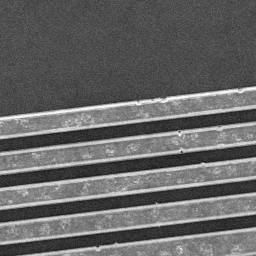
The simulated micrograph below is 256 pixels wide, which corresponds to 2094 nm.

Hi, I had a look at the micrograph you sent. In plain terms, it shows parallel lines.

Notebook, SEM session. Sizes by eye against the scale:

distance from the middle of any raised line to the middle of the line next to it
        286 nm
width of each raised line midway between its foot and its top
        146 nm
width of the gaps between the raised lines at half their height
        0.138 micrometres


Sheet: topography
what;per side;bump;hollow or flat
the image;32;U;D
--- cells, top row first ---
DDDDDDDDDDDDDDDDDDDDDDDDDDDDDDDD
DDDDDDDDDDDDDDDDDDDDDDDDDDDDDDDD
DDDDDDDDDDDDDDDDDDDDDDDDDDDDDDDD
DDDDDDDDDDDDDDDDDDDDDDDDDDDDDDDD
DDDDDDDDDDDDDDDDDDDDDDDDDDDDDDDD
DDDDDDDDDDDDDDDDDDDDDDDDDDDDDDDD
DDDDDDDDDDDDDDDDDDDDDDDDDDDDDDDD
DDDDDDDDDDDDDDDDDDDDDDDDDDDDDDDD
DDDDDDDDDDDDDDDDDDDDDDDDDDDDDDDD
DDDDDDDDDDDDDDDDDDDDDDDDDDDDDDDD
DDDDDDDDDDDDDDDDDDDDDDDDDDDDDDDD
DDDDDDDDDDDDDDDDDDDDDDDDDDDDUUUU
DDDDDDDDDDDDDDDDDDDDDUUUUUUUUUUU
DDDDDDDDDDDUUUUUUUUUUUUUUUUUUUUD
DDDDUUUUUUUUUUUUUUUUUUDDDDDDDDDD
UUUUUUUUUUUUUUDDDDDDDDDDDDDDDDDD
UUUUUUDDDDDDDDDDDDDDDDDDUUUUUUUU
DDDDDDDDDDDDDDDUUUUUUUUUUUUUUUUU
DDDDDDDUUUUUUUUUUUUUUUUUUUDDDDDD
UUUUUUUUUUUUUUUUUDDDDDDDDDDDDDDD
UUUUUUUUUDDDDDDDDDDDDDDDDDDUUUUU
UDDDDDDDDDDDDDDDDDUUUUUUUUUUUUUU
DDDDDDDDDDUUUUUUUUUUUUUUUUUUUDDD
DDUUUUUUUUUUUUUUUUUUDDDDDDDDDDDD
UUUUUUUUUUUUDDDDDDDDDDDDDDDDDDUU
UUUUDDDDDDDDDDDDDDDDDDUUUUUUUUUU
DDDDDDDDDDDDDUUUUUUUUUUUUUUUUUUU
DDDDDUUUUUUUUUUUUUUUUUUUDDDDDDDD
UUUUUUUUUUUUUUUUDDDDDDDDDDDDDDDD
UUUUUUUUDDDDDDDDDDDDDDDDDUUUUUUU
DDDDDDDDDDDDDDDDUUUUUUUUUUUUUUUU
DDDDDDDDUUUUUUUUUUUUUUUUUUUUUUUU